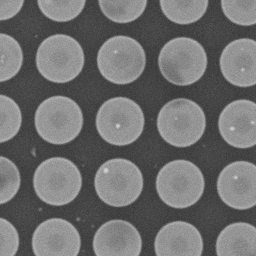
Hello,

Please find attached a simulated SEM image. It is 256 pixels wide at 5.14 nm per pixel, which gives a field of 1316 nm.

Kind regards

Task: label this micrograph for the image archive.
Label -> an array of small figures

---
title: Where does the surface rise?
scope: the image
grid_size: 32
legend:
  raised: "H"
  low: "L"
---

HHHLLHHHHHHLHHHHHHLLHHHHHHLLHHHH
HHLLLHHHHHLLLHHHHHLLHHHHHHLLHHHH
LLLLLLLHHLLLLLHHHLLLLHHHHLLLLHHH
LLLLLLLLLLLLLLLLLLLLLLLLLLLLLLLL
HLLLLLLHHLLLLLLLLLLLLLLLLLLLLLLL
HHLLLHHHHHLLLHHHHLLLLHHHHLLLLHHH
HHHLLHHHHHLLHHHHHHLLHHHHHHLLHHHH
HHHLLHHHHHLLHHHHHHLLHHHHHHLLHHHH
HHLLLHHHHHLLHHHHHHLLHHHHHHLLHHHH
HHLLLHHHHHLLLHHHHLLLHHHHHLLLHHHH
LLLLLLLLLLLLLLLLLLLLLLHHLLLLLHHH
LLLLLLLLLLLLLLLLLLLLLLLLLLLLLLLL
HLLLLLHHHLLLLLHHLLLLLLHHLLLLLLLL
HHLLLHHHHHLLLHHHHLLLHHHHHLLLHHHH
HHHLHHHHHHLLHHHHHHLLHHHHHHLHHHHH
HHHLHHHHHHLLHHHHHHLLHHHHHHLHHHHH
HHLLLHHHHHLLHHHHHHLLHHHHHLLLHHHH
HLLLLLHHHLLLLHHHHLLLLHHHHLLLHHHH
LLLLLLLLLLLLLLLLLLLLLLLLLLLLLLLL
LLLLLLLLLLLLLLLLLLLLLLLLLLLLLLLL
HHLLLHHHHLLLLHHHHLLLLHHHLLLLLHHH
HHLLHHHHHHLLHHHHHHLLHHHHHLLLHHHH
HHLLHHHHHHLLHHHHHHLLHHHHHLLHHHHH
HHLLHHHHHHLLHHHHHHLLHHHHHLLHHHHH
HHLLLHHHHHLLHHHHHLLLHHHHHLLLHHHH
LLLLLLHHLLLLLLHHLLLLLHHHLLLLHHHH
LLLLLLLLLLLLLLLLLLLLLLLLLLLLLLLL
HLLLLLHHLLLLLLLLLLLLLLLLLLLLLLLL
HHLLLHHHHLLLHHHHHLLLHHHHLLLLHHHH
HHLLHHHHHHLLHHHHHLLLHHHHHLLHHHHH
HHLLHHHHHHLLHHHHHHLHHHHHHLLHHHHH
HHLLHHHHHHLLHHHHHLLHHHHHHLLHHHHH